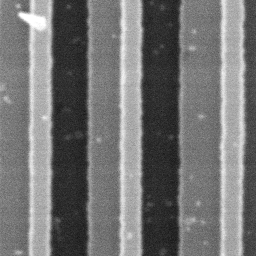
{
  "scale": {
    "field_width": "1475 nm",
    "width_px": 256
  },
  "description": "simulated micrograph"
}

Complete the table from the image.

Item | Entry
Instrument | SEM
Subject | lines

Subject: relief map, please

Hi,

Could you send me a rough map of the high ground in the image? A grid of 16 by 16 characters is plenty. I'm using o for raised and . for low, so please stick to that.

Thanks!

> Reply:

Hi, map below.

ooo...ooo..oooo.
ooo...ooo..oooo.
ooo...ooo..oooo.
ooo...ooo..oooo.
ooo...ooo..oooo.
ooo...ooo..oooo.
ooo...ooo..oooo.
ooo...ooo..oooo.
ooo...ooo..oooo.
ooo...ooo..oooo.
ooo...ooo..oooo.
ooo...ooo..oooo.
ooo...ooo..oooo.
ooo...ooo..oooo.
ooo...ooo..oooo.
ooo...ooo..oooo.